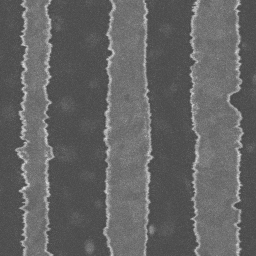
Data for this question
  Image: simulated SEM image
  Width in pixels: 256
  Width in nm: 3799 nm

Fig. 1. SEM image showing one or a few lines or trenches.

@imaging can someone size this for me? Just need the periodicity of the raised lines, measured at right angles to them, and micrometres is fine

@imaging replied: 1.33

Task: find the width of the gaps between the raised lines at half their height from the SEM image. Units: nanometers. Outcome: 782